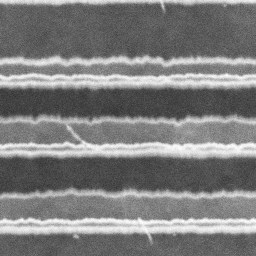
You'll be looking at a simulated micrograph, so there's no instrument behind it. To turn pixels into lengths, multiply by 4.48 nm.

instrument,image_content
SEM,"lines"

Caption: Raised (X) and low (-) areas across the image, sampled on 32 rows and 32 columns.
--------------------------------
--------------------------------
--------------------------------
--------------------------------
--------------------------------
--------------------------------
--------------------------------
------------------X-------------
XXXXXXXXXXXXXXXXXXXXXXXXXXXXXXXX
XXXXXXXXXXXXXXXXXXXXXXXXXXXXXXXX
XXXXXXXXXXXXXXXXXX-XXXXXXXXXXX--
--------------------------------
--------------------------------
--------------------------------
--------------------------------
XXXXXXXXXXXXXXXXXXXXXXXXXXXXXXXX
XXXXXXXXXXXXXXXXXXXXXXXXXXXXXXXX
XXXXXXXXXXXXXXXXXXXXXXXXXXXXXXXX
XXXXXXXXXXXXXXXXXXXXXXXXXXXXXXXX
--------------------------------
--------------------------------
--------------------------------
--------------------------------
--------------------------------
----XXXXXXXXXX-XXXXXXX-X-X-XXXX-
XXXXXXXXXXXXXXXXXXXXXXXXXXXXXXXX
XXXXXXXXXXXXXXXXXXXXXXXXXXXXXXXX
XXXXXXXXXXXXXXXXXXXXXXXXXXXXXXXX
XXXXXXXXXXXXXXXXXXXXXXXXXXXXXXXX
--------------------------------
--------------------------------
--------------------------------